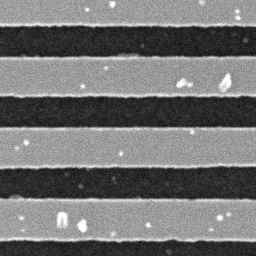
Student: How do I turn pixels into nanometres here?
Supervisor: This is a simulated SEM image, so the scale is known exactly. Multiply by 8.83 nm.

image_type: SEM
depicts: lines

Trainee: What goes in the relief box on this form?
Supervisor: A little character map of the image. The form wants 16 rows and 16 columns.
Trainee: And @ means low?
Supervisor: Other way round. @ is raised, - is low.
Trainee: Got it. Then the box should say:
@@@@@@@@@@@@@@@@
@@@@@@@@@@@@@@@@
----------------
----------------
@@@@@@@@@@@@@@@@
@@@@@@@@@@@@@@@@
----------------
----------------
@@@@@@@@@@@@@@@@
@@@@@@@@@@@@@@@@
@---------------
----------------
@@@@@@@@@@@@@@@@
@@@@@@@@@@@@@@@@
@@@@@@@@@@@@@@@@
----------------